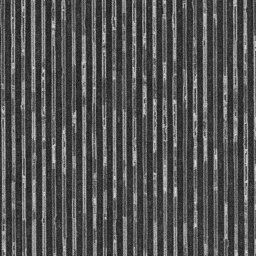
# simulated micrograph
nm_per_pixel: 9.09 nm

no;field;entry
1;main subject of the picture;parallel lines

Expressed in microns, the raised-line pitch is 0.0918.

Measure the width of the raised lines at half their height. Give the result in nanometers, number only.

34.1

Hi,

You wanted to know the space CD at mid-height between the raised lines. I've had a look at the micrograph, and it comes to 6.62 pixels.